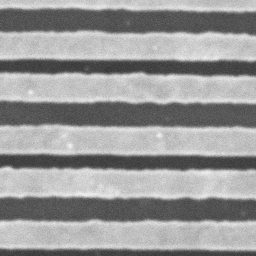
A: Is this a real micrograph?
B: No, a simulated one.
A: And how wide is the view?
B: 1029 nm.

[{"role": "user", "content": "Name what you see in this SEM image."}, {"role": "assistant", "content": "lines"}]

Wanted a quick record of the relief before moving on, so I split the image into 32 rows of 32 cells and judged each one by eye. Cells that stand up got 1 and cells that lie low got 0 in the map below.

11111111111111111111111111111111
00000000000000000000000000000000
00000000000000000000000000000000
00000000000000000000000000000000
11111111111111111111111111111110
11111111111111111111111111111111
11111111111111111111111111111111
00000000000000000000000000000001
00000000000000000000000000000000
11111111111111111111111110000000
11111111111111111111111111111111
11111111111111111111111111111111
11111111111111111111111111111111
00000000000000000000000000000000
00000000000000000000000000000000
00000000000000000000000000000000
11111111111111111111111111111111
11111111111111111111111111111111
11111111111111111111111111111111
00000000000000000000000000000000
00000000000000000000000000000000
11111111111111111111111111111111
11111111111111111111111111111111
11111111111111111111111111111111
11111101111111111111111111111111
00000000000000000000000000000000
00000000000000000000000000000000
00000000000000000000000000000000
11111111111111111111111111111111
11111111111111111111111111111111
11111111111111111111111111111111
00000000000000000000000000000000